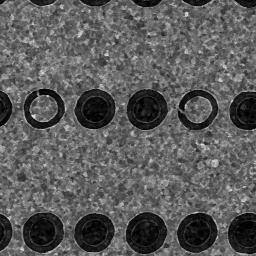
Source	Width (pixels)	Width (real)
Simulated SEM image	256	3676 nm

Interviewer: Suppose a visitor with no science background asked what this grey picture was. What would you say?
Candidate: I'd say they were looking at a regular array of ring-shaped grooves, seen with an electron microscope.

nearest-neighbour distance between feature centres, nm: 727